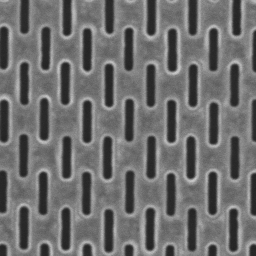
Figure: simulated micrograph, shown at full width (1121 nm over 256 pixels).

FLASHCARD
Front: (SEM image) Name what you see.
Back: a regular array of holes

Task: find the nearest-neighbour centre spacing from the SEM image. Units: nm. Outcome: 178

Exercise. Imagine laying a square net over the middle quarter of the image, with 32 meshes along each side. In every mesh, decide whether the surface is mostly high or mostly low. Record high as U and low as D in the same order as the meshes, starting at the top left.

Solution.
DDUUDDDUUUDDUUUDDUUUUDDUUUDDUUUD
DDUUUDDUUUDDDUUDDUUUUDDUUUDDUUUD
DDUUUUUUUUDDDUUUUUUUUDDUUUUUUUUD
DDUUUUUUUUDDDUUUUUUUUDDUUUUUUUUD
DDUUUUUUUUDDDUUUUUUUUDDUUUUUUUUD
DDUUUUUUUUDDDUUUUUUUUDDUUUUUUUUD
DDUUUUUUUUDDDUUUUUUUUDDUUUUUUUUD
DUUUUUUUUUDDDUUUUUUUUDDUUUUUUUUD
DDUUUUUUUUDDDUUUUUUUUDDUUUUUUUUD
DUUUUDDUUUDDDUUDDUUUUDDUUUDDUUUD
UUUUUDDUUUUDUUUDDDUUUDUUUUDDUUUU
UUUUUDDUUUUUUUUDDDUUUUUUUUDDUUUU
UUUUUDDUUUUUUUUDDDUUUUUUUUDDUUUU
UUUUUDDUUUUUUUUDDDUUUUUUUUDDUUUU
UUUUUDDUUUUUUUUDDDUUUUUUUUDDUUUU
UUUUUDDUUUUUUUUDDDUUUUUUUUDDUUUU
UUUUUDDUUUUUUUUDDDUUUUUUUUDDUUUU
UUUUUDDUUUUUUUUDDDUUUUUUUUDDUUUU
DDUUUDDUUUDDUUUDDUUUUDDUUUDDUUUD
DDUUUDUUUUDDUUUUUUUUUDDUUUDUUUUD
DDUUUUUUUUDDUUUUUUUUUDDUUUUUUUUD
DDUUUUUUUUDDUUUUUUUUUDDUUUUUUUUD
DDUUUUUUUUDDUUUUUUUUUDDUUUUUUUUD
DDUUUUUUUUDDUUUUUUUUUDDUUUUUUUUD
DDUUUUUUUUDDUUUUUUUUUDDUUUUUUUUD
DDUUUUUUUUDDUUUUUUUUUDDUUUUUUUUD
DDUUUUUUUUDDUUUUUUUUUDDUUUUUUUUD
DDUUUDDUUUDDUUUUDDUUUDDUUUDUUUUD
DUUUDDDUUUDDUUUDDDUUUDDUUDDDUUUD
UUUUDDDUUUUUUUUDDDUUUUUUUDDDUUUU
UUUUDDDUUUUUUUUDDDUUUUUUUDDDUUUU
UUUUDDDUUUUUUUUDDDUUUUUUUDDDUUUU